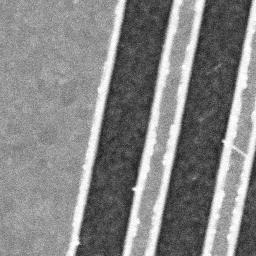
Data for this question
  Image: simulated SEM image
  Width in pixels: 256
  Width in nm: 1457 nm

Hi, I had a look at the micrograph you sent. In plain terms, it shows one or a few lines or trenches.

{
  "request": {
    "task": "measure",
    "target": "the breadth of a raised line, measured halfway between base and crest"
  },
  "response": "131 nm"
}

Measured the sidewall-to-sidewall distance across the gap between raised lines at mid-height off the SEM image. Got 309 nanometres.